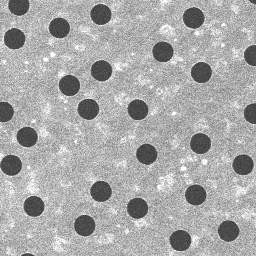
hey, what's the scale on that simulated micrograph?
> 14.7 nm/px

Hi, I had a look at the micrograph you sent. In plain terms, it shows a regular array of holes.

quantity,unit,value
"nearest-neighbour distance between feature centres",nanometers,668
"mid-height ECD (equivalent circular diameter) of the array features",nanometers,314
